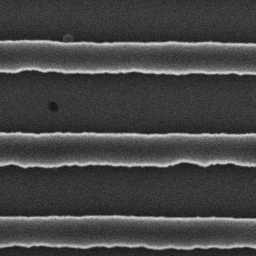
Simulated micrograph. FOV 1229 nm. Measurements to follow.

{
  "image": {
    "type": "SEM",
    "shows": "lines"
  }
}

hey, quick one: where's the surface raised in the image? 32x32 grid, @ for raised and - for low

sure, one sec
--------------------------------
--------------------------------
--------------------------------
--------------------------------
--------------------------------
@@@@@@@@@@@@@@@@@@@@@@@@@@@@@@@-
@@@@@@@@@@@@@@@@@@@@@@@@@@@@@@@@
@@@@@@@@@@@@@@@@@@@@@@@@@@@@@@@@
@@@@@@@@@@@@@@@@@@@@@@@@@@@@@@@@
--------------------------------
--------------------------------
--------------------------------
--------------------------------
--------------------------------
--------------------------------
--------------------------------
--------------------------------
@@@@@@@@@@@@@@@@@@@@@@@@@@@@@@@@
@@@@@@@@@@@@@@@@@@@@@@@@@@@@@@@@
@@@@@@@@@@@@@@@@@@@@@@@@@@@@@@@@
@-@@@@@@@@@@@@@@@@@@@@---@----@@
--------------------------------
--------------------------------
--------------------------------
--------------------------------
--------------------------------
--------------------------------
@@@@@@@@@@@@@@@@@@@@@@@@@@@@@@@@
@@@@@@@@@@@@@@@@@@@@@@@@@@@@@@@@
@@@@@@@@@@@@@@@@@@@@@@@@@@@@@@@@
@@@@@@@@@@@@@@@@@@@@@@@@@@@@@@@@
--------------------------------